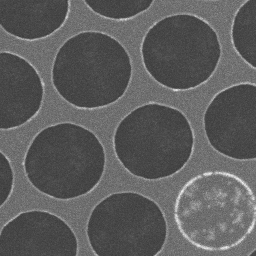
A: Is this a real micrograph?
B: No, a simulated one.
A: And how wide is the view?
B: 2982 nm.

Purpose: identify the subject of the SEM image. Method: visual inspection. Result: holes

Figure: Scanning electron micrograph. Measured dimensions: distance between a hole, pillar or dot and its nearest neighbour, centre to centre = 1.06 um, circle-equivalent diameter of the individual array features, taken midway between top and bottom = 895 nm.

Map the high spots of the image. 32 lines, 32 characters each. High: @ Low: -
---------@@--------@@@@@@@@@@@@-
--------@@@@------@@@@@@@@@@@@--
--------@@@@@@@@@@@@-----@@@@---
-------@@@@@@@@@@@@-------@@@---
@@----@@@-----@@@@---------@@---
@@@@@@@@-------@@@---------@@---
@@@@@@@---------@@----------@@--
---@@@@---------@@---------@@@@-
----@@@---------@@---------@@@@@
-----@@---------@@@-------@@@@@@
-----@@---------@@@@-----@@@@@-@
-----@@---------@@@@@@@@@@@@----
-----@@@-------@@@@@@@@@@@@-----
-----@@@@@@@@@@@@----@@@@@------
----@@@@@@@@@@@@-------@@@------
---@@@@@-@@@@@@---------@@------
@@@@@------@@@----------@@------
@@@@--------@@----------@@------
@@@@---------@----------@@@-----
-@@----------@@---------@@@@----
-@@----------@@--------@@@@@@@@@
--@----------@@@------@@@@@@@@@@
--@@--------@@@@@@@@@@@@@@@@@@@@
-@@@@-------@@@@@@@@@@@@@@@@@@@@
-@@@@@----@@@@----@@@@@@@@@@@@@@
@@@@@@@@@@@@-------@@@@@@@@@@@@@
@@@---@@@@@@--------@@@@@@@@@@@@
@@------@@@----------@@@@@@@@@@@
---------@@----------@@@@@@@@@@@
---------@@----------@@@@@@@@@@@
----------@---------@@@@@@@@@@@@
----------@@--------@@@@@@@@@@@@